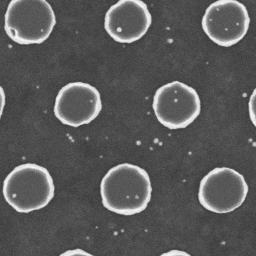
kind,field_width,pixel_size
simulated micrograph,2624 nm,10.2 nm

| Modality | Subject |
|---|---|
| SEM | raised bodies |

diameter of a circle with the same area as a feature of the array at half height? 464 nanometres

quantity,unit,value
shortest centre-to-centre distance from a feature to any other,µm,1